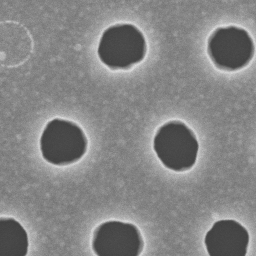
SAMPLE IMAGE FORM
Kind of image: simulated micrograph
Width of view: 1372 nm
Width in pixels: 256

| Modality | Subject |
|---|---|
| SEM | holes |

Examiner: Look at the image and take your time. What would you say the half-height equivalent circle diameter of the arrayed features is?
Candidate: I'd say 246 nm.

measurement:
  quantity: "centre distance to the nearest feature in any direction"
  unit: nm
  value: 594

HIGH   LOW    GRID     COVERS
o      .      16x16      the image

oooooooooooooooo
oooooooooooooooo
oooooo...oooo...
oooooo...oooo...
oooooooooooooooo
oooooooooooooooo
oooooooooooooooo
oooooooooooooooo
ooo..ooooo..oooo
ooo..ooooo..oooo
ooooooooooo.oooo
oooooooooooooooo
oooooooooooooooo
oooooooooooooooo
..oooo...oooo..o
..oooo...oooo..o